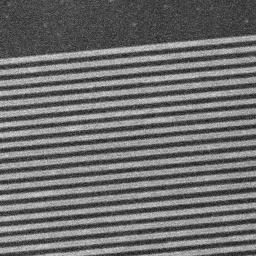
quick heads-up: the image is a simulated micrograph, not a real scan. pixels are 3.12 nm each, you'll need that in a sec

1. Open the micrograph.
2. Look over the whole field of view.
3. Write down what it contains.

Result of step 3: parallel lines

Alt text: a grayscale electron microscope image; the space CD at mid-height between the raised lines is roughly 18.2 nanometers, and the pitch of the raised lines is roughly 32.5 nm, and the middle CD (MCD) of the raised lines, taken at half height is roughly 15.1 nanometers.